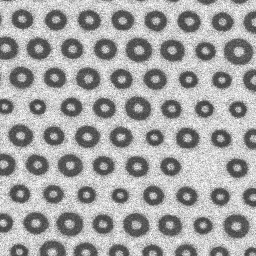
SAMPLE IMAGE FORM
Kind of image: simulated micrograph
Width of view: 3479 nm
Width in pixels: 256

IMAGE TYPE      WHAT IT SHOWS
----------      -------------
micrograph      a regular array of ring-shaped grooves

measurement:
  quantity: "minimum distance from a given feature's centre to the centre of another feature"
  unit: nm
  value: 449